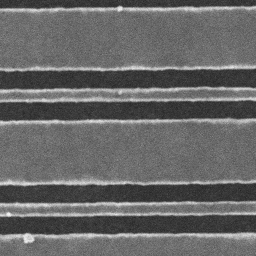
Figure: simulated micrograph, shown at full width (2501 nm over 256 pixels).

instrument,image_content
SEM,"lines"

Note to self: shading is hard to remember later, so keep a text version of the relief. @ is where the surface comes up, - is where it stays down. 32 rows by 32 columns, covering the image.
--------------------------------
@@@@@@@@@@@@@@@@@@@@@@@@@@@@@@@@
@@@@@@@@@@@@@@@@@@@@@@@@@@@@@@@@
@@@@@@@@@@@@@@@@@@@@@@@@@@@@@@@@
@@@@@@@@@@@@@@@@@@@@@@@@@@@@@@@@
@@@@@@@@@@@@@@@@@@@@@@@@@@@@@@@@
@@@@@@@@@@@@@@@@@@@@@@@@@@@@@@@@
@@@@@@@@@@@@@@@@@@@@@@@@@@@@@@@@
@@@@@@@@@@@@@@@@@@@@@@@@@@@@@@@@
--------------------------------
--------------------------------
@@@@@@@@@@@@@@@@@@@@@@@@@@@@@@@@
@@@@@@@@@@@@@@@@@@@@@@@@@@@@@@-@
--------------------------------
--------------------------------
@@@@@@@@@@@@@@@@@@@@@@@@@@@@@@@@
@@@@@@@@@@@@@@@@@@@@@@@@@@@@@@@@
@@@@@@@@@@@@@@@@@@@@@@@@@@@@@@@@
@@@@@@@@@@@@@@@@@@@@@@@@@@@@@@@@
@@@@@@@@@@@@@@@@@@@@@@@@@@@@@@@@
@@@@@@@@@@@@@@@@@@@@@@@@@@@@@@@@
@@@@@@@@@@@@@@@@@@@@@@@@@@@@@@@@
@@@@@@@@@@@@@@@@@@@@@@@@@@@@@@@@
--------------------------------
--------------------------------
@@@@@@@@@@@@@@@@@@@@@@@@@@@@@@@@
@@@@@@@@@@@@@@@@@@@@@@@@@@@@@@@@
--------------------------------
--------------------------------
@@@@@@@@@@@@@@@@@@@@@@@@@@@@@@@@
@@@@@@@@@@@@@@@@@@@@@@@@@@@@@@@@
@@@@@@@@@@@@@@@@@@@@@@@@@@@@@@@@